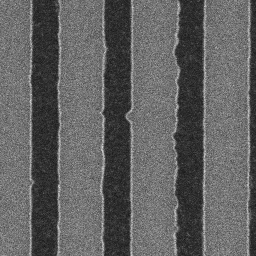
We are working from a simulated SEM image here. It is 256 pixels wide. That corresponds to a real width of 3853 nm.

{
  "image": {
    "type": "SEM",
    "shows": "one or a few lines or trenches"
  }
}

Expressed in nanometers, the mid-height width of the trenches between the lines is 659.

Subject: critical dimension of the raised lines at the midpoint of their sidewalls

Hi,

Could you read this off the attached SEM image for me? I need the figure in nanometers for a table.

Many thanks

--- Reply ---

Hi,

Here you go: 431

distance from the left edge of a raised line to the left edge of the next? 1.09 um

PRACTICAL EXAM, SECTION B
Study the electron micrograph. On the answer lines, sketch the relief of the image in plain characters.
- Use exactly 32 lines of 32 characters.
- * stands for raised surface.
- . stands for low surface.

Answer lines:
....***......***......****.....*
....****.....***......****.....*
....***......***......****.....*
....***......***......****.....*
....***......***......****.....*
....***......***......****.....*
....****.....***......****.....*
....***......****.....****.....*
....***......****.....****.....*
....***......***......****.....*
....***......***......***......*
....***......***......***......*
....***......****.....****.....*
....***......****.....****.....*
....****.....***......****.....*
....****.....***......***......*
....***......***......****.....*
....***......****.....****.....*
....***......***......****.....*
....***......***......****.....*
....***......***......****.....*
....***......***......****.....*
....****.....***......****.....*
....***......***......***......*
....***......***......***......*
....***......***......****.....*
....***......****.....***......*
....***......***......***......*
....***......***......****.....*
....***......***......****.....*
....***......***......****.....*
....***......***......****.....*